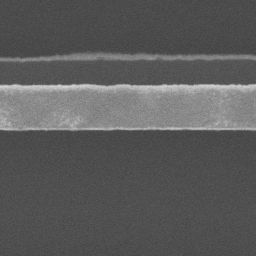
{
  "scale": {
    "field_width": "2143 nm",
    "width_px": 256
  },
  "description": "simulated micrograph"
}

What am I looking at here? lines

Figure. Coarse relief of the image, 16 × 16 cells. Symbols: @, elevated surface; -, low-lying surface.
----------------
----------------
----------------
----------------
@@@@@@@@@@@@@@@@
@@@@@@@@@@@@@@@@
@@@@@@@@@@@@@@@@
@@@@@@@@@@@@@@@@
----------------
----------------
----------------
----------------
----------------
----------------
----------------
----------------